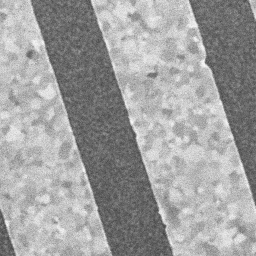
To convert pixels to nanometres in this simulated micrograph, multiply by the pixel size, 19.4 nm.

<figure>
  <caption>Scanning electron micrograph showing one or a few lines or trenches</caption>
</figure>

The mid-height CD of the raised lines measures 1770 nanometers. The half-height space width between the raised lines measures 1150 nm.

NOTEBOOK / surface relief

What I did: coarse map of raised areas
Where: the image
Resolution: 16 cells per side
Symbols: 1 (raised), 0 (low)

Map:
1100001111110000
1100001111110000
1110000111111000
1110000111111000
1110000111111000
1111000011111100
1111000011111100
1111000011111100
1111100001111110
1111100001111110
1111100001111110
1111110001111110
1111110000111111
1111110000111111
0111110000111111
0111111000011111